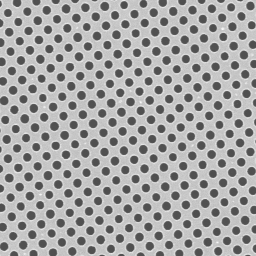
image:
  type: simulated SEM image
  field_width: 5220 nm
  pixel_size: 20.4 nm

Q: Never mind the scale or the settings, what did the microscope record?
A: a regular array of holes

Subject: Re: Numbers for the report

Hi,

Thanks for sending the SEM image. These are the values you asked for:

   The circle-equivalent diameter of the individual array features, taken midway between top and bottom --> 0.178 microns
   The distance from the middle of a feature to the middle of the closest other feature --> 276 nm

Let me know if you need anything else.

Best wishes